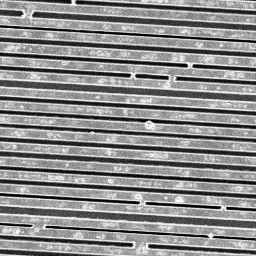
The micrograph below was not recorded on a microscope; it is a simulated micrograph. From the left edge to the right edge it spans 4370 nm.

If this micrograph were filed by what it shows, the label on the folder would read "parallel lines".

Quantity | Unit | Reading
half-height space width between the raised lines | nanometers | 76.7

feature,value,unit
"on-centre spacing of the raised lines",0.24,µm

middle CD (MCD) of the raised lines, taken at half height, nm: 166